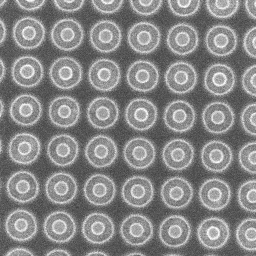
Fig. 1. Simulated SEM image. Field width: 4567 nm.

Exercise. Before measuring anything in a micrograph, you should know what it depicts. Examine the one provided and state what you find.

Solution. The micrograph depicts an array of small figures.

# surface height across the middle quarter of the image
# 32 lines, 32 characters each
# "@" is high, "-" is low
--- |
----@@@------@@@@-----@@@@@----@
@@--@@@--@@---@@@------@@@------
@@--@@---@@---@@--@@@--@@@--@@--
@---@@@--@@---@@--@@@--@@@--@@@-
---@@@@------@@@---@---@@@--@@--
--@@@@@@----@@@@@-----@@@@------
@@@@@@@@@@@@@@@@@@@-@@@@@@@----@
@@@@@@@@@@@@@@@@@@@@@@@@@@@@@@@@
-@@@@@@@@@@@@@@@@@@@@@@@@@@@@@@@
---@@@@@----@@@@@----@@@@@@@--@@
---@@@@------@@@------@@@@@----@
@---@@--@@@--@@@--@@---@@@------
@--@@@--@@@--@@@--@@@--@@@--@@--
---@@@---@@--@@@--@@@--@@--@@@--
---@@@@-----@@@@------@@@@------
-@@@@@@@---@@@@@@----@@@@@-----@
@@@@@@@@@@@@@@@@@@@@@@@@@@@@--@@
@@@@@@@@@@@@@@@@@@@@@@@@@@@@@@@@
--@@@@@@---@@@@@@@@@@@@@@@@@@@@@
---@@@@-----@@@@@----@@@@@@---@@
@--@@@---@---@@@------@@@@-----@
@--@@@--@@@--@@---@@--@@@---@---
@--@@@--@@@--@@--@@@--@@@--@@@--
---@@@------@@@@--@@--@@@--@@@--
--@@@@@-----@@@@------@@@@-----@
@@@@@@@@--@@@@@@@---@@@@@@----@@
@@@@@@@@@@@@@@@@@@@@@@@@@@@@@@@@
@@@@@@@@@@@@@@@@@@@@@@@@@@@@@@@@
--@@@@@----@@@@@@@-@@@@@@@@@@@@@
--@@@@------@@@@-----@@@@@----@@
@--@@---@@--@@@---@---@@@------@
@--@@--@@@---@@--@@@--@@@--@@---